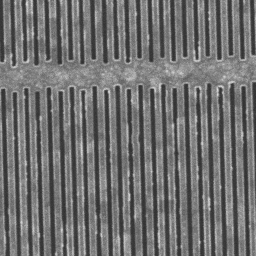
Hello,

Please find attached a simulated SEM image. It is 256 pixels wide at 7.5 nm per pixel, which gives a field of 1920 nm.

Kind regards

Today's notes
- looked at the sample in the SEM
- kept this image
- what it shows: parallel lines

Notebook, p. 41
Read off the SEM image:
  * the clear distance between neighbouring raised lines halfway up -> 0.0366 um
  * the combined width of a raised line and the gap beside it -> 85.7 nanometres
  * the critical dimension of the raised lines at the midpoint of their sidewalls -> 6.75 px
